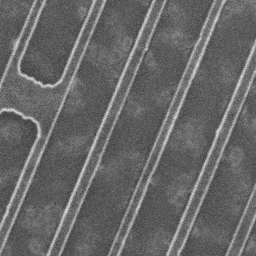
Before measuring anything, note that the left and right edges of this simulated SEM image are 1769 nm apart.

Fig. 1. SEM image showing parallel lines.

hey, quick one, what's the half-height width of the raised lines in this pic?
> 75 nanometres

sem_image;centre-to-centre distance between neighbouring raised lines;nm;382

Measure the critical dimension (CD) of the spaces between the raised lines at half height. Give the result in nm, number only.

307